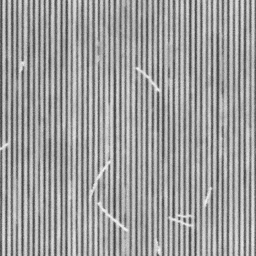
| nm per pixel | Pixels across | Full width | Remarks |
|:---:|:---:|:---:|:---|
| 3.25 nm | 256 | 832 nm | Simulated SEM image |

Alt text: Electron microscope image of parallel lines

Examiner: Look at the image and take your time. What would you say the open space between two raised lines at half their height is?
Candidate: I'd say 6.5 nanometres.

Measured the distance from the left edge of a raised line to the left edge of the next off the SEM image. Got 0.0176 um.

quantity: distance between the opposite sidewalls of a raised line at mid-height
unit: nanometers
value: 9.3